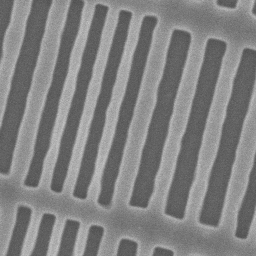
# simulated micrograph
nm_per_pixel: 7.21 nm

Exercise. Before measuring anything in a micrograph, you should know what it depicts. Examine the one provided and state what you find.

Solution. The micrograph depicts groups of lines, slits or small figures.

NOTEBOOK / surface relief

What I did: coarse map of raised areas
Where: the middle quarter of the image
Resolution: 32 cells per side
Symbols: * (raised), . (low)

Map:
.***...***....***...*****.....**
.***...***....**....*****.....**
.**....***...***....*****.....**
.**....**....***....****......**
***....**....***...*****.....***
***...***....***...****......***
***...***...***....****......***
**....***...***....****.....****
**....**....***...*****.....****
**...***....**....*****.....****
*....***...***....*****.....****
*....***...***....****.....*****
*....**....**.....****.....****.
*...***....**....*****.....****.
....***...***....****......****.
....**....***....****.....*****.
....**....***...*****.....****..
...***....**....*****.....****..
...***....**....*****.....***...
...**....***....****.....****...
..***....***...*****.....****...
..***....**....****......****...
..***....**....****......****...
..**....***....****......***....
..**....**....*****.....****....
.***....**....*****.....****....
.***....**....****......****....
.***....*.....****.....****.....
.**....**....*****.....****.....
***....**....****......****.....
***...***....****......***......
**....***....****......***......